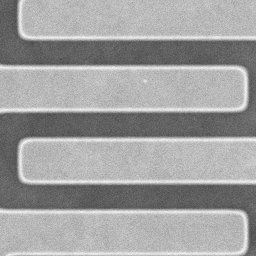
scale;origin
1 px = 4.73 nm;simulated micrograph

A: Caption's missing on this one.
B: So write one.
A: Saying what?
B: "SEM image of groups of lines, slits or small figures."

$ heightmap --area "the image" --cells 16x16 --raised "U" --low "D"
DUUUUUUUUUUUUUUU
DUUUUUUUUUUUUUUU
DDDDDDDDDDDDDDDD
DDDDDDDDDDDDDDDD
UUUUUUUUUUUUUUUD
UUUUUUUUUUUUUUUD
UUUUUUUUUUUUUUUD
DDDDDDDDDDDDDDDD
DDDDDDDDDDDDDDDD
DUUUUUUUUUUUUUUU
DUUUUUUUUUUUUUUU
DDDDDDDDDDDDDDDD
DDDDDDDDDDDDDDDD
UUUUUUUUUUUUUUUD
UUUUUUUUUUUUUUUD
UUUUUUUUUUUUUUUD